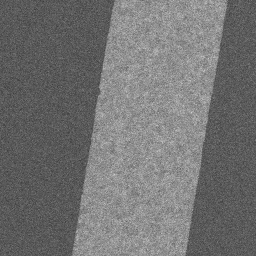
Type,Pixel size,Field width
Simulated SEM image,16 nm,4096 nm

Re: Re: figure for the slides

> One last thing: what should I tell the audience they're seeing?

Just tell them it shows one or a few lines or trenches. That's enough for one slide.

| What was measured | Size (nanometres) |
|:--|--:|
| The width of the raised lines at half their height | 1600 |